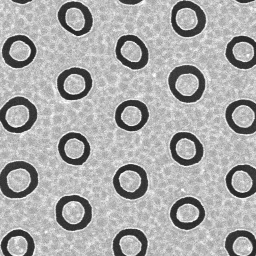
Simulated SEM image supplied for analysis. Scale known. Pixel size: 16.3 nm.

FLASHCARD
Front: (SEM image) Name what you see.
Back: a regular array of ring-shaped grooves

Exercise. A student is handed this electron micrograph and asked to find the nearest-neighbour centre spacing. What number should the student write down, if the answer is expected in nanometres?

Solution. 1050